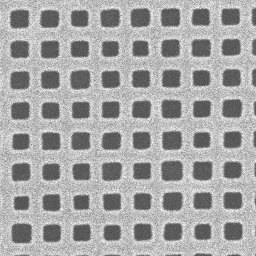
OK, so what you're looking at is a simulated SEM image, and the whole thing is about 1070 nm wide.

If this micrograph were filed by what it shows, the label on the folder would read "a regular array of holes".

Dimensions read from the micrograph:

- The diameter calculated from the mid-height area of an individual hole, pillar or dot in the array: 81.7 nm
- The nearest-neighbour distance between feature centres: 125 nm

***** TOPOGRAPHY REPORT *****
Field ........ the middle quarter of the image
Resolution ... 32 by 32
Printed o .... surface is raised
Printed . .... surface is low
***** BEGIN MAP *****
oooooooooooooooooooooooooooooooo
oooooooooooooooooo...ooooo..oooo
oo.....oo.....ooo.....oo.....ooo
oo.....oo.....ooo.....oo.....ooo
oo.....oo.....ooo.....oo.....ooo
oo....oooo....ooo....oooo....ooo
oooooooooooooooooooooooooooooooo
oooooooooooooooooooooooooooooooo
oooooooooooooooooooooooooooooooo
ooo...oooo....ooo....oooo....ooo
oo.....oo.....ooo.....oo.....ooo
oo.....oo.....ooo.....oo.....ooo
oo.....oo.....ooo.....oo......oo
oo....oooo...ooooo...oooo....ooo
oooooooooooooooooooooooooooooooo
oooooooooooooooooooooooooooooooo
oooooooooooooooooooooooooooooooo
oo....oooo....ooo.....ooo.....oo
oo.....oo.....ooo.....oo......oo
oo.....oo.....ooo.....oo......oo
oo.....oo.....ooo.....oo.....ooo
ooo..ooooo...ooooooooooooo..oooo
oooooooooooooooooooooooooooooooo
oooooooooooooooooooooooooooooooo
ooooooooooo...ooooooooooo....ooo
oo.....ooo....ooo.....oo......oo
oo.....oo.....ooo.....oo......oo
oo.....oo.....ooo.....oo......oo
oo....oooo....ooo.....ooo....ooo
oooooooooooooooooooooooooooooooo
oooooooooooooooooooooooooooooooo
oooooooooooooooooooooooooooooooo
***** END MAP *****